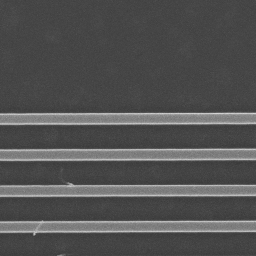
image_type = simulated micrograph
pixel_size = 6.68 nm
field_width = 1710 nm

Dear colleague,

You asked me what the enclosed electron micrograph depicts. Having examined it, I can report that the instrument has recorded parallel lines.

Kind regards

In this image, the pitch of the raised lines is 36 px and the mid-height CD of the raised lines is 0.0693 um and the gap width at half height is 171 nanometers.